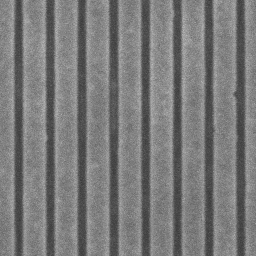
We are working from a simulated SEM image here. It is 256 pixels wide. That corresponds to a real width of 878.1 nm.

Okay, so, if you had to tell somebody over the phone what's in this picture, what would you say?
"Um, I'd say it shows parallel lines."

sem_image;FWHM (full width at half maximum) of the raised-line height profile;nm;73.7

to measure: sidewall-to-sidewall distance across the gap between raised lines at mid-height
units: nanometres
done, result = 35.6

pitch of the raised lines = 109 nm